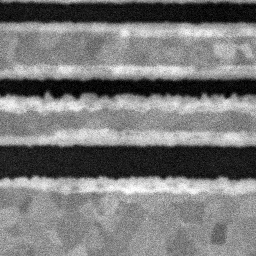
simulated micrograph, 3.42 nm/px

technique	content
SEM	one or a few lines or trenches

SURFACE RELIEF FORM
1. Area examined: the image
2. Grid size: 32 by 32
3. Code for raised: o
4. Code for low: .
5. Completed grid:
................................
................................
................................
oo........o.....................
oooooooooooooooooooooooooooooooo
oooooooooooooooooooooooooooooooo
oooooooooooooooooooooooooooooooo
oooooooooooooooooooooooooooooooo
oooooooooooooooooooooooooooooooo
................................
................................
................................
.o.oo..o..o....o...o........o...
oooooooooooooooooooooooooooooooo
oooooooooooooooooooooooooooooooo
oooooooooooooooooooooooooooooooo
oooooooooooooooooooooooooooooooo
..o.ooooo.oo.ooooooooooooooooooo
................................
................................
................................
................................
......................o.........
oooooooooooooooooooooooooooooooo
oooooooooooooooooooooooooooooooo
oooooooooooooooooooooooooooooooo
oooooooooooooooooooooooooooooooo
oooooooooooooooooooooooooooooooo
oooooooooooooooooooooooooooooooo
oooooooooooooooooooooooooooooooo
oooooooooooooooooooooooooooooooo
oooooooooooooooooooooooooooooooo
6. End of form